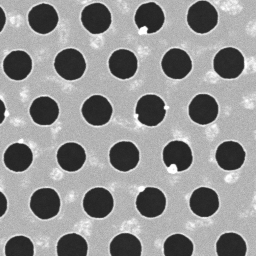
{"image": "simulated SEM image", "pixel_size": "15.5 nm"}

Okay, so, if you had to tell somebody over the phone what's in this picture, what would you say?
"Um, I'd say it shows a regular array of holes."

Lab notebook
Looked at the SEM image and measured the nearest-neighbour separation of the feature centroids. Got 0.815 µm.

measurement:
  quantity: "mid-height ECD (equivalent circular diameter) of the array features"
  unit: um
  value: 0.474